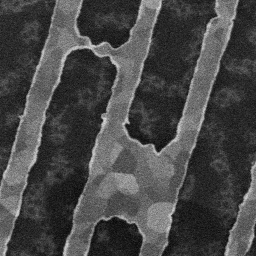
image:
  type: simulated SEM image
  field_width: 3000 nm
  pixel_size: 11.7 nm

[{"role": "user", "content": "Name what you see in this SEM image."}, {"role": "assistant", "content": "one or a few lines or trenches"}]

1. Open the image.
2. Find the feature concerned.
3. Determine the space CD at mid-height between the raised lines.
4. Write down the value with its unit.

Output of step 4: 0.647 micrometres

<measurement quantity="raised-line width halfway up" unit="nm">258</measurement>